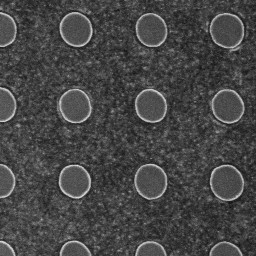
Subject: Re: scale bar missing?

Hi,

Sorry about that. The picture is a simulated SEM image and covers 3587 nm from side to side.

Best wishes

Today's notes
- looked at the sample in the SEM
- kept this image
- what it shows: a regular array of raised bodies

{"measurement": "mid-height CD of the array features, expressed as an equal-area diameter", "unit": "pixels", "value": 32.5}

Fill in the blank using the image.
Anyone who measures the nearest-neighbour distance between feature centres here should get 1060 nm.